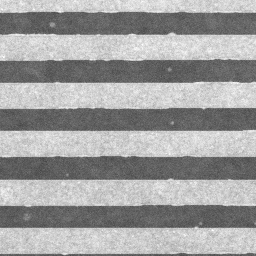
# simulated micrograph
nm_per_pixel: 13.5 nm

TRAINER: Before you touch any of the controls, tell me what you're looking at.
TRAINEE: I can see lines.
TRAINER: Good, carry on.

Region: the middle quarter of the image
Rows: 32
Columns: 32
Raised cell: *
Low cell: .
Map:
................................
................................
................................
................................
................................
********************************
********************************
********************************
********************************
********************************
********************************
................................
................................
................................
................................
................................
................................
********************************
********************************
********************************
********************************
********************************
********************************
................................
................................
................................
................................
................................
................................
********************************
********************************
********************************